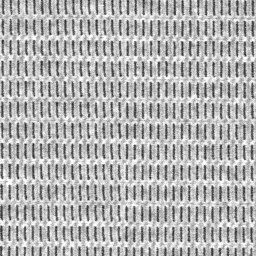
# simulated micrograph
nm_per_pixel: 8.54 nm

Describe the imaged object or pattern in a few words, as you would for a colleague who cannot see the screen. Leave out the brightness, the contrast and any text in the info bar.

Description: a regular array of holes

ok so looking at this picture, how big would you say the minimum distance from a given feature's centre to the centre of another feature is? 66 nanometers